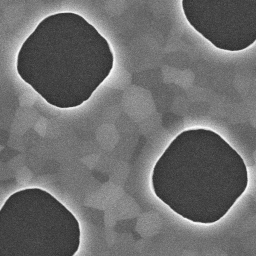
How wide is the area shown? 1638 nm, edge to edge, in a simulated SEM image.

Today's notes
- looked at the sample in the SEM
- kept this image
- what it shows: holes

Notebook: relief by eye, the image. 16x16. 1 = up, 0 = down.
1111111111100000
1100001111110000
1100000111111000
1000000111111111
1000000111111111
1100001111111111
1110011111111111
1111111111111111
1111111111100011
1111111111000001
1111111111000001
1111111111000001
0000111111000001
0000011111100011
0000011111111111
0000011111111111